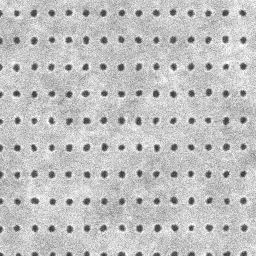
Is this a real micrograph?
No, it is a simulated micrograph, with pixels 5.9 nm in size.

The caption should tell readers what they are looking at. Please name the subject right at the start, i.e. a regular array of holes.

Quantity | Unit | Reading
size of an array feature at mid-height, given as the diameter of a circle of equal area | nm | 45.6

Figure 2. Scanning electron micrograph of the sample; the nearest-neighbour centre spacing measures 17.1 px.